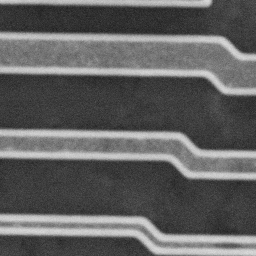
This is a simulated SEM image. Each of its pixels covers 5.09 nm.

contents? groups of lines, slits or small figures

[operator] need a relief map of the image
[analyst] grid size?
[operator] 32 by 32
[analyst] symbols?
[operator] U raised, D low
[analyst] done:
DDDDDDDDDDDDDDDDDDDDDDDDDDDDDDDD
DDDDDDDDDDDDDDDDDDDDDDDDDDDDDDDD
DDDDDDDDDDDDDDDDDDDDDDDDDDDDDDDD
DDDDDDDDDDDDDDDDDDDDDDDDDDDDDDDD
UUDDDDDDDDDDDDDDDDDDDDDDDDDDDDDD
UUUUUUUUUUUUUUUUUUUUUUUUUUUUDDDD
UUUUUUUUUUUUUUUUUUUUUUUUUUUUUDDD
UUUUUUUUUUUUUUUUUUUUUUUUUUUUUUUU
UUUUUUUUUUUUUUUUUUUUUUUUUUUUUUUU
DDDDDDDDDDDDDDDDDDDDDDDDDDUUUUUU
DDDDDDDDDDDDDDDDDDDDDDDDDDDUUUUU
DDDDDDDDDDDDDDDDDDDDDDDDDDDDDDDD
DDDDDDDDDDDDDDDDDDDDDDDDDDDDDDDD
DDDDDDDDDDDDDDDDDDDDDDDDDDDDDDDD
DDDDDDDDDDDDDDDDDDDDDDDDDDDDDDDD
DDDDDDDDDDDDDDDDDDDDDDDDDDDDDDDD
DDDDDDDDDDDDDDDDDDDDDDDDDDDDDDDD
UUUUUUUUUUUUUUUUUUUUUUUDDDDDDDDD
UUUUUUUUUUUUUUUUUUUUUUUUDDDDDDDD
DDDDDDDDDDUUUUUUUUUUUUUUUUUUUUUU
DDDDDDDDDDDDDDDDDDDDDDUUUUUUUUUU
DDDDDDDDDDDDDDDDDDDDDDDUUUUUUUUU
DDDDDDDDDDDDDDDDDDDDDDDDDDDDDDDD
DDDDDDDDDDDDDDDDDDDDDDDDDDDDDDDD
DDDDDDDDDDDDDDDDDDDDDDDDDDDDDDDD
DDDDDDDDDDDDDDDDDDDDDDDDDDDDDDDD
DDDDDDDDDDDDDDDDDDDDDDDDDDDDDDDD
UUUUUUUUUUUUUUUUUDDDDDDDDDDDDDDD
UUUUUUUUUUUUUUUUUUUDDDDDDDDDDDDD
DDDDDDDDDDDDDDDDDUUUDDDDDDDDDDDD
DDDDDDDDDDDDDDDDDDUUUUUUUUUUUUUU
DDDDDDDDDDDDDDDDDDDDDDDUUUUUUUUU